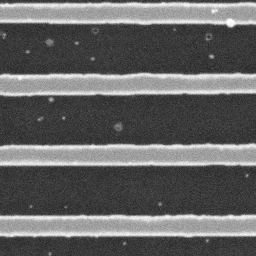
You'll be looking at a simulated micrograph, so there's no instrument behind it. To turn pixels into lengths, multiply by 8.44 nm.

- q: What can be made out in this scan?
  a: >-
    lines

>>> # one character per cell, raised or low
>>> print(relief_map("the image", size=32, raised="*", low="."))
.............*..*...****......**
********************************
********************************
................................
................................
................................
................................
................................
................................
********************************
********************************
********************************
................................
................................
................................
................................
................................
................................
********************************
********************************
********************************
................................
................................
................................
................................
................................
................................
********************************
********************************
................................
................................
................................